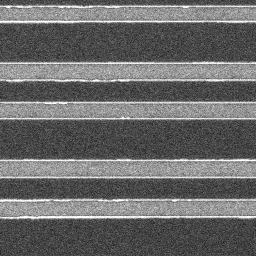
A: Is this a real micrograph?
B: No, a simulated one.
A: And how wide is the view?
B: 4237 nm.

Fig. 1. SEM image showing lines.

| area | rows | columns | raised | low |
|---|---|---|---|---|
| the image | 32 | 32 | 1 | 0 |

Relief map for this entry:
11111111111111111111111111111111
00000000000000000000000000000000
00000000000000000000000000000000
11111111111111111111111111111111
11111111111111111111111111111111
11111111111111111111111111111111
11111111111111111111111111111111
11111111111111111111111111111111
00000000000000000000000000000000
00000000000000000000000000000000
11111111111111111111111111111111
11111111111111111111111111111111
11111111111111111111111111111111
00000000000000000000000000000000
00000000000000000000000000000000
11111111111111111111111111111111
11111111111111111111111111111111
11111111111111111111111111111111
11111111111111111111111111111111
11111111111111111111111111111111
00000000000000000000000000000000
00000000000000000000000000000000
11111111111111111111111111111111
11111111111111111111111111111111
11111111111111111111111111111111
00000000000000000000000000000000
00000000000000000000000000000000
11111111111111111111111111111111
11111111111111111111111111111111
11111111111111111111111111111111
11111111111111111111111111111111
11111111111111111111111111111111